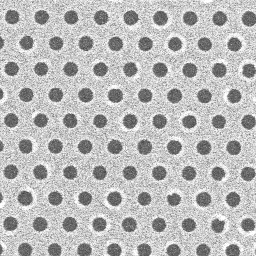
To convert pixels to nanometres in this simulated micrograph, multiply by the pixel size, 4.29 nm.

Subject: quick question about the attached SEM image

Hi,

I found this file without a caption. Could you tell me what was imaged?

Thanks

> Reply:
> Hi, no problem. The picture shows a regular array of holes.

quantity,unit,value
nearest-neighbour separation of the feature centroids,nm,127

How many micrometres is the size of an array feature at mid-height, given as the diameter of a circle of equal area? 0.0626